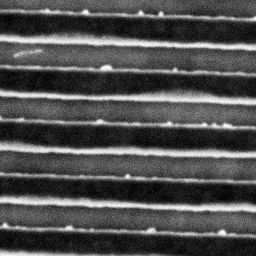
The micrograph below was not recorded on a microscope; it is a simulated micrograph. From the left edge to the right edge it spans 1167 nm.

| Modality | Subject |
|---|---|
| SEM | lines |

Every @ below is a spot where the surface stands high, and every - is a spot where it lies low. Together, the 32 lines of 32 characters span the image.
--------------------------------
@@@@@@@@------------------------
@@@@@@@@@@@@@@@@@@@@@@@@@@@@@@@@
@@@@@@@@@@@@@@@@@@@@@@@@@@@@@@@@
@@@@@@@@@@@@@@@@@@@@@@@@@@@@@@@@
------------------@@@@@@@@@@@@@@
--------------------------------
--------------------------------
@@@@@-@-------------------------
@@@@@@@@@@@@@@@@@@@@@@@@@@@@@@@@
@@@@@@@@@@@@@@@@@@@@@@@@@@@@@@@@
@@@@@@@@@@@@@@@@@@@@@@@@@@@@@@@@
--------------------------@@@@@@
--------------------------------
--------------------------------
@@@@@@@@@@@@@@@@@@--------------
@@@@@@@@@@@@@@@@@@@@@@@@@@@@@@@@
@@@@@@@@@@@@@@@@@@@@@@@@@@@@@@@@
--@@@@@@@@@@@@@@@@@@@@@@@@@@@@@@
--------------------------------
--------------------------------
--------------------------------
@@@@@@@@@@@@@@@@@@@@@@@@@-------
@@@@@@@@@@@@@@@@@@@@@@@@@@@@@@@@
@@@@@@@@@@@@@@@@@@@@@@@@@@@@@@@@
-----------@@@@@@@@@@@@@@@@@@@@@
--------------------------------
--------------------------------
@@@@----------------------------
@@@@@@@@@@@@@@@@@@@@@@@@@@@@@@@@
@@@@@@@@@@@@@@@@@@@@@@@@@@@@@@@@
@@@@@@@@@@@@@@@@@@@@@@@@@@@@@@@@